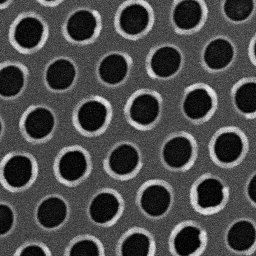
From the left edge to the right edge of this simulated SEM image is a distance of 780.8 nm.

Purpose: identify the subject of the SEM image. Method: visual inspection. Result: a regular array of holes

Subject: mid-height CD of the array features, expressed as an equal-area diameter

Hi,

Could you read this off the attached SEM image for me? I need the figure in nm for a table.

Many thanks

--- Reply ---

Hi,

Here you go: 93.1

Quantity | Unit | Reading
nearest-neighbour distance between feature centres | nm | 158